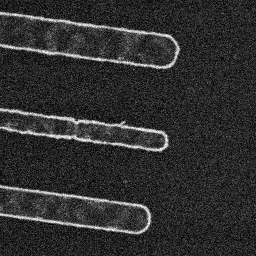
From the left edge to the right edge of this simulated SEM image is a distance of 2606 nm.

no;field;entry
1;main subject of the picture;one or a few lines or trenches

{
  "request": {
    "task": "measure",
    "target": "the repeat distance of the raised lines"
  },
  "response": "868 nm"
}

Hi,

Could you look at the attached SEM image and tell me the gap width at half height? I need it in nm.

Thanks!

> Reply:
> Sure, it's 628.